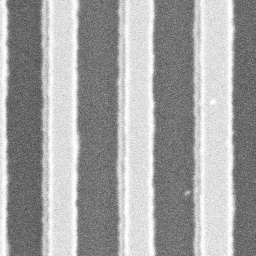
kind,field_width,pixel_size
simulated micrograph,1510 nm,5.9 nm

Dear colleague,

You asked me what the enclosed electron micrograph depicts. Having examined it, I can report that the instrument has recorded lines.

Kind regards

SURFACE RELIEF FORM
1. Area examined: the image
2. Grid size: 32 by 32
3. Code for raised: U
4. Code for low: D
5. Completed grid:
UDDDDUUUUDDDDDDUUUUDDDDDDUUUUDDD
UDDDDUUUUDDDDDDUUUUDDDDDUUUUUDDD
UDDDDUUUUUDDDDDUUUUDDDDDUUUUUDDD
UDDDDUUUUUDDDDDUUUUDDDDDUUUUUDDD
UDDDDUUUUDDDDDDUUUUDDDDDUUUUUDDD
UDDDDUUUUUDDDDDUUUUDDDDDDUUUUDDD
UDDDDDUUUDDDDDDUUUUDDDDDDUUUUDDD
UDDDDDUUUDDDDDDUUUUDDDDDDUUUUDDD
UDDDDUUUUDDDDDDUUUUDDDDDDUUUUDDD
UDDDDUUUUDDDDDDUUUUDDDDDUUUUUDDD
UDDDDUUUUDDDDDDUUUUDDDDDUUUUUDDD
UDDDDUUUUDDDDDDUUUUDDDDDUUUUUDDD
UDDDDUUUUDDDDDDUUUUDDDDDUUUUUDDD
UDDDDUUUUDDDDDDUUUUDDDDDUUUUUDDD
UDDDDUUUUDDDDDDUUUUDDDDDUUUUUDDD
UDDDDDUUUDDDDDDUUUUDDDDDDUUUUDDD
UDDDDUUUUDDDDDDUUUUDDDDDUUUUUDDD
UDDDDDUUUDDDDDDUUUUDDDDDDUUUUDDD
UDDDDUUUUUDDDDDUUUUDDDDDUUUUUDDD
UDDDDUUUUDDDDDDUUUUDDDDDUUUUUDDD
UDDDDUUUUDDDDDDUUUUDDDDDDUUUUDDD
UDDDDUUUUDDDDDDUUUUDDDDDDUUUUDDD
UDDDDUUUUDDDDDDUUUUDDDDDUUUUUDDD
UDDDDUUUUDDDDDDUUUUDDDDDUUUUUDDD
UDDDDUUUUDDDDDDUUUUDDDDDUUUUUDDD
UDDDDDUUUDDDDDDUUUUDDDDDUUUUUDDD
UDDDDDUUUDDDDDDUUUUDDDDDUUUUUDDD
UDDDDUUUUDDDDDDUUUUDDDDDDUUUUDDD
UDDDDDUUUDDDDDDUUUUDDDDDDUUUUDDD
UDDDDUUUUUDDDDDUUUUDDDDDUUUUUDDD
UDDDDUUUUDDDDDDUUUUDDDDDUUUUUDDD
UDDDDUUUUDDDDDDUUUUDDDDDUUUUUDDD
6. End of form